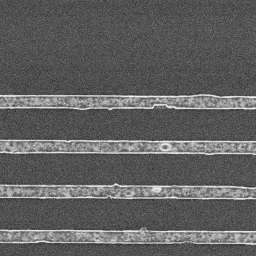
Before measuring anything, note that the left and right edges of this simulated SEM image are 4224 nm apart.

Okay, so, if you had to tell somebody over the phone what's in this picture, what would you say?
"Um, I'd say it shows parallel lines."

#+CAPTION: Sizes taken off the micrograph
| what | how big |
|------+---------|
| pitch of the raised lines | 742 nanometres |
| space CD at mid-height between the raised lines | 538 nm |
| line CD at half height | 202 nanometres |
